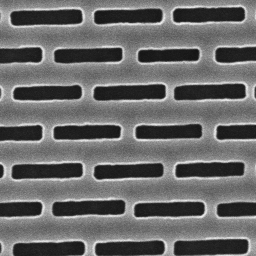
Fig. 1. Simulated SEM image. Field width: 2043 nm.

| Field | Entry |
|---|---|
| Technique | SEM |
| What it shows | a regular array of holes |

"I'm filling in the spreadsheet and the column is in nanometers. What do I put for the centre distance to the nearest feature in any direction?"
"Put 442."